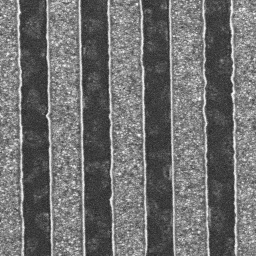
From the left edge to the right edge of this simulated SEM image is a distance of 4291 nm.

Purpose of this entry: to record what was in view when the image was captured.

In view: one or a few lines or trenches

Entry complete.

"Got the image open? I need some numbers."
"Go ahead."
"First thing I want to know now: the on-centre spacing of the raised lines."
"1030 nm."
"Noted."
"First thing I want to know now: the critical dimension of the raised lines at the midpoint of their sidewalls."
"0.559 µm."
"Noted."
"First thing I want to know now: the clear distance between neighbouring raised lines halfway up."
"0.467 µm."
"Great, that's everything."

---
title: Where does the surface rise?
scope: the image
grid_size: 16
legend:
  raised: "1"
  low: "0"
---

1001100110011011
1001100110011011
1001100110011011
1001100110011001
1001100110011001
1001100110011001
1001100110011001
1001100110011001
1001100110011001
1001100110011001
1001100110011001
1001100110011001
1001100110011001
1001100110011001
1001100110011001
1001100110011001